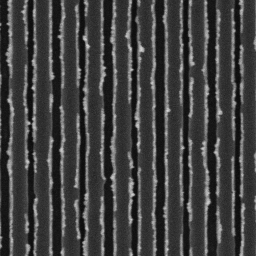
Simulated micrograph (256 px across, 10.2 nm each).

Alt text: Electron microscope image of parallel lines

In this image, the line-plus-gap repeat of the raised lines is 264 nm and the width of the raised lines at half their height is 188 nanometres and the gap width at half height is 71.5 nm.